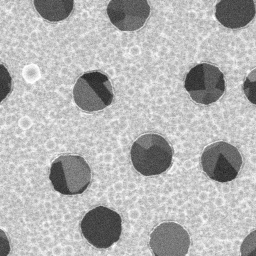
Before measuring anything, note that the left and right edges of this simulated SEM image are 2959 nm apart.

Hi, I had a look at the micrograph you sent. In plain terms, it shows raised bodies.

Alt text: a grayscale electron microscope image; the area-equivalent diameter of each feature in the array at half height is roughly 488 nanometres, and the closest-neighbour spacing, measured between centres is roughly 816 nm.